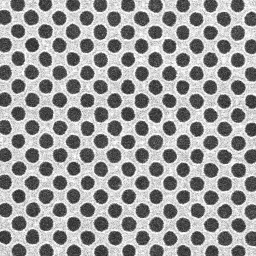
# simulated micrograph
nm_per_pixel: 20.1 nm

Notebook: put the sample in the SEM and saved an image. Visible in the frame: a regular array of holes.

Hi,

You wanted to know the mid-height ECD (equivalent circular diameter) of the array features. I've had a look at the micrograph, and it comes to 15.3 pixels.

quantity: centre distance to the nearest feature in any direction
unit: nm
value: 382